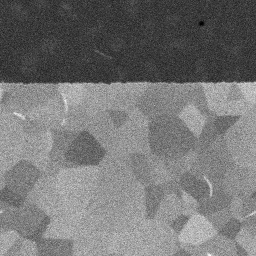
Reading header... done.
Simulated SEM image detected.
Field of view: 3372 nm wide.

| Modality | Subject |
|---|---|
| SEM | one or a few lines or trenches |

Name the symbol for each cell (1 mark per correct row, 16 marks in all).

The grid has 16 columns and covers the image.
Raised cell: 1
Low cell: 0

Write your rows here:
0000000000000000
0000000000000000
0000000000000000
0000000000000000
0000000000000000
1111111111111111
1111111111111111
1111111111111111
1111111111111111
1111111111111111
1111111111111111
1111111111111111
1111111111111111
1111111111111111
1111111111111111
1111111111111111